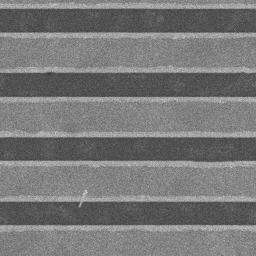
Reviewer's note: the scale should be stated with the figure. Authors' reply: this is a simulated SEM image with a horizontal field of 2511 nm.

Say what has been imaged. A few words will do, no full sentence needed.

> one or a few lines or trenches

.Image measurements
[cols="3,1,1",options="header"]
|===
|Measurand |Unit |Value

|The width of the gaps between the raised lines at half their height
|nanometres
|274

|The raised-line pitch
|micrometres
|0.631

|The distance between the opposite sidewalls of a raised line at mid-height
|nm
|359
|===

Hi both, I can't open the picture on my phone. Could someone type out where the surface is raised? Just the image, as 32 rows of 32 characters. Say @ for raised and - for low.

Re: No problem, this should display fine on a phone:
@@@@@@@@@@@@@@@@@@@@@@@@@@@@@@@@
--------------------------------
--------------------------------
--------------------------------
@@@@@@@@@@@@@@@@@@@@@@@@@@@@@@@@
@@@@@@@@@@@@@@@@@@@@@@@@@@@@@@@@
@@@@@@@@@@@@@@@@@@@@@@@@@@@@@@@@
@@@@@@@@@@@@@@@@@@@@@@@@@@@@@@@@
@@@@@@@@@@@@@@@@@@@@@@@@@@@@@@@@
--------------------------------
--------------------------------
--------------------------------
@@@@@@@@@@@@@@@@@@@@@@@@@@@@@@@@
@@@@@@@@@@@@@@@@@@@@@@@@@@@@@@@@
@@@@@@@@@@@@@@@@@@@@@@@@@@@@@@@@
@@@@@@@@@@@@@@@@@@@@@@@@@@@@@@@@
@@@@@@@@@@@@@@@@@@@@@@@@@@@@@@@@
--------------------------------
--------------------------------
--------------------------------
@@@@@@@@@@@@@@@@@@@@@@@@-----@@@
@@@@@@@@@@@@@@@@@@@@@@@@@@@@@@@@
@@@@@@@@@@@@@@@@@@@@@@@@@@@@@@@@
@@@@@@@@@@@@@@@@@@@@@@@@@@@@@@@@
@@@@@@@@@@@@@@@@@@@@@@@@@@@@@@@@
--------------------------------
--------------------------------
--------------------------------
@@@@@@@@@@@@@@@@@@@@@@@@@@@@@@@@
@@@@@@@@@@@@@@@@@@@@@@@@@@@@@@@@
@@@@@@@@@@@@@@@@@@@@@@@@@@@@@@@@
@@@@@@@@@@@@@@@@@@@@@@@@@@@@@@@@